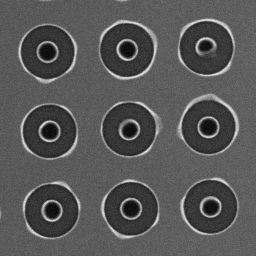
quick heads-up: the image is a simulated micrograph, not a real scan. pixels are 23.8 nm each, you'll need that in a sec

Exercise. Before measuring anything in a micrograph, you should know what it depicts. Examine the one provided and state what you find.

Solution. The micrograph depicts an array of small figures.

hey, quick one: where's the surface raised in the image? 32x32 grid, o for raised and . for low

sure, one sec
oooooooooooooooooooooooooooooooo
oooooooooooooooooooooooooooooooo
oooooooooooooooooooooooooooooooo
oooo....oooooo....ooooo.....oooo
ooo......oooo......oooo......ooo
ooo..oo..oooo..oo..ooo...oo..ooo
oo...oo..oooo..oo..ooo...o...ooo
ooo..oo..oooo......oooo......ooo
ooo......oooo......ooooo....oooo
oooo....ooooooo..ooooooooooooooo
oooooooooooooooooooooooooooooooo
oooooooooooooooooooooooooooooooo
ooooooooooooooooooooooooo..ooooo
oooo....oooooo....ooooo......ooo
ooo......oooo......oooo......ooo
ooo..oo..oooo..oo...ooo..oo...oo
ooo..oo...ooo..oo...oo...oo...oo
ooo...o...ooo......oooo......ooo
ooo......ooooo.....ooooo....oooo
ooooo...oooooooo.ooooooooooooooo
oooooooooooooooooooooooooooooooo
oooooooooooooooooooooooooooooooo
oooooooooooooooooooooooooo..oooo
ooooo....ooooo.....ooooo.....ooo
ooo......oooo......oooo......ooo
ooo...o...ooo..oo...ooo..oo...oo
ooo..ooo..ooo..ooo..ooo..oo...oo
ooo...o...ooo.......ooo......ooo
oooo.....ooooo.....ooooo....oooo
ooooo...ooooooo..ooooooooooooooo
oooooooooooooooooooooooooooooooo
oooooooooooooooooooooooooooooooo